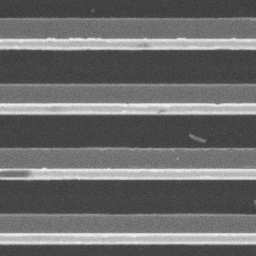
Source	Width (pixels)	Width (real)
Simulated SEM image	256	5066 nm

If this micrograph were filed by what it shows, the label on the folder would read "lines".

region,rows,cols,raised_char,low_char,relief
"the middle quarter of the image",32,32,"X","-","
--------------------------------
--------------------------------
--------------------------------
--------------------------------
--------------------------------
XXXXXXXXXXXXXXXXXXXXXXXXXXXXXXXX
XXXXXXXXXXXXXXXXXXXXXXXXXXXXXXXX
XXXXXXXXXXXXXXXXXXXXXXXXXXXXXXXX
XXXXXXXXXXXXXXXXXXXXXXXXXXXXXXXX
XXXXXXXXXXXXXXXXXXXXXXXXXXXXXXXX
XXXXXXXXXXXXXXXXXXXXXXXXXXXXXXXX
XXXXXXXXXXXXXXXXXXXXXXXXXXXXXXXX
--------------------------------
--------------------------------
--------------------------------
--------------------------------
--------------------------------
--------------------------------
--------------------------------
--------------------------------
--------------------------------
XXXXXXXXXXXXXXXXXXXXXXXXXXXXXXXX
XXXXXXXXXXXXXXXXXXXXXXXXXXXXXXXX
XXXXXXXXXXXXXXXXXXXXXXXXXXXXXXXX
XXXXXXXXXXXXXXXXXXXXXXXXXXXXXXXX
XXXXXXXXXXXXXXXXXXXXXXXXXXXXXXXX
XXXXXXXXXXXXXXXXXXXXXXXXXXXXXXXX
XXXXXXXXXXXXXXXXXXXXXXXXXXXXXXXX
XXXXXXXXXXXXXXXXXXXXXXXXXXXXXXXX
--------------------------------
--------------------------------
--------------------------------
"